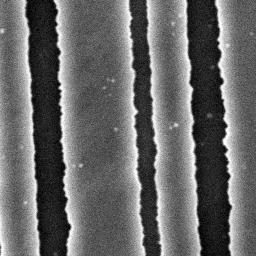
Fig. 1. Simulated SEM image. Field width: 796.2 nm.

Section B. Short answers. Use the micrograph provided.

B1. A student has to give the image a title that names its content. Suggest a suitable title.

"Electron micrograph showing lines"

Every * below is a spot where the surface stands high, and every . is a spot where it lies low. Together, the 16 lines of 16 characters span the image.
**..********..**
**..********..**
**..********..**
**..********..**
**..********..**
**..********..**
**..********..**
**..********..**
**..********..**
**..********..**
**..********..**
**..********..**
**..********..**
**..********..**
**..********..**
**..********..**